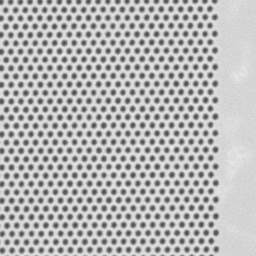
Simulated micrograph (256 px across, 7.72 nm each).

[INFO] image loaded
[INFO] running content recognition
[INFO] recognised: a regular array of holes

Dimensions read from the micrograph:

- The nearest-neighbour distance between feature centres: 72.3 nanometers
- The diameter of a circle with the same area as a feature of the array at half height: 50.1 nm